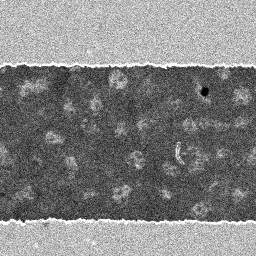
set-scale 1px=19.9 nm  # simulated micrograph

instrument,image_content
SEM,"one or a few lines or trenches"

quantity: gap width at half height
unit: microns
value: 3.1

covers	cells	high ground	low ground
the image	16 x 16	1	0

1111111111111111
1111111111111111
1111111111111111
1111111111111111
0000000000000000
0000000000000000
0000000000000000
0000000000000000
0000000000000000
0000000000000000
0000000000000000
0000000000000000
0000000000000000
0000000000000000
1111111111111111
1111111111111111